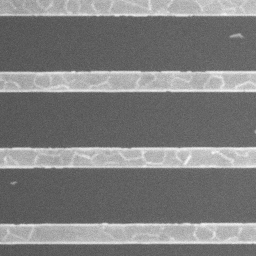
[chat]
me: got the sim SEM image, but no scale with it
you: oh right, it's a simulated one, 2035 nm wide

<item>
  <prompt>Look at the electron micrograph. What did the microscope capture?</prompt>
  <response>lines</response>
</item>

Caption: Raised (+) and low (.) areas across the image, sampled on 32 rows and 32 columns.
++++++++++++++++++++++++++++++++
++++++++++++++++++++++++++++++++
................................
................................
................................
................................
................................
................................
................................
++++++++++++++++++++++++++++++++
++++++++++++++++++++++++++++++++
................................
................................
................................
................................
................................
................................
................................
................................
++++++++++++++++++++++++++++++++
++++++++++++++++++++++++++++++++
................................
................................
................................
................................
................................
................................
................................
++++++++++++++++++++++++++++++++
++++++++++++++++++++++++++++++++
................................
................................